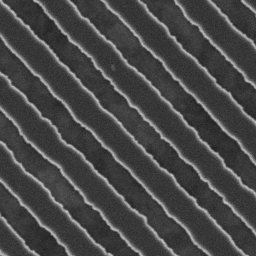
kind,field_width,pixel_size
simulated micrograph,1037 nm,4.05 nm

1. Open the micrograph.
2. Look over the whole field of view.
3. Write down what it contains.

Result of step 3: lines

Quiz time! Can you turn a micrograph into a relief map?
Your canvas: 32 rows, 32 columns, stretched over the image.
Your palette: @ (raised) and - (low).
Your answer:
@----@@@@----@@@@@----@@@@@----@
@@----@@@@----@@@@@----@@@@@----
@@@----@@@@----@@@@@----@@@@@---
@@@@---@@@@@----@@@@@----@@@@---
@@@@@---@@@@@----@@@@@----@@@@@-
-@@@@@---@@@@@----@@@@-----@@@@@
--@@@@@---@@@@@----@@@@-----@@@@
---@@@@----@@@@@----@@@@@----@@@
---@@@@@----@@@@@----@@@@@---@@@
@----@@@@----@@@@@---@@@@@----@@
@-----@@@@----@@@@@----@@@@----@
@@@---@@@@@----@@@@@---@@@@@----
@@@----@@@@@----@@@@@----@@@@---
@@@@@---@@@@@----@@@@@---@@@@@--
-@@@@----@@@@@----@@@@@---@@@@@-
--@@@@@---@@@@@----@@@@----@@@@@
--@@@@@----@@@@@----@@@@@---@@@@
---@@@@@----@@@@@----@@@@----@@@
@---@@@@@----@@@@@----@@@@----@@
@@---@@@@@----@@@@@---@@@@@----@
@@-----@@@@----@@@@@----@@@@----
@@@-----@@@@----@@@@@----@@@@---
@@@@@---@@@@@----@@@@@---@@@@@--
-@@@@@---@@@@@----@@@@@---@@@@@-
--@@@@@---@@@@@----@@@@@----@@@@
---@@@@----@@@@@----@@@@@---@@@@
----@@@@----@@@@@----@@@@@---@@@
@----@@@@----@@@@@----@@@@@---@@
@-----@@@@----@@@@@----@@@@@---@
@@-----@@@@----@@@@@----@@@@@---
@@@-----@@@@----@@@@@---@@@@@---
@@@@----@@@@@----@@@@@----@@@@--